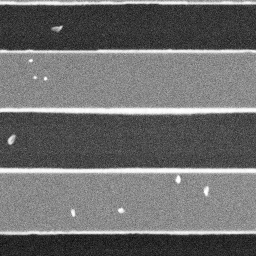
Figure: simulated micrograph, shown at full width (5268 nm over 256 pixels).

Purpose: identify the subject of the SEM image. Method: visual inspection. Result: lines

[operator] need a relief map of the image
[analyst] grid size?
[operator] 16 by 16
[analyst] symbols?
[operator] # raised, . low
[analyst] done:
................
................
................
################
################
################
################
................
................
................
................
################
################
################
################
................